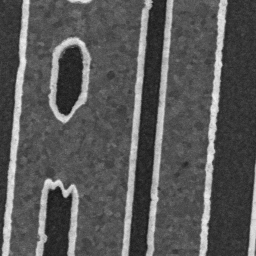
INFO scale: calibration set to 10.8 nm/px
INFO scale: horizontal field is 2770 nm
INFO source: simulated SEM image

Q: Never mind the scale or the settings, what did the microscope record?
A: one or a few lines or trenches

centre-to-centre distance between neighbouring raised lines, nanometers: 917